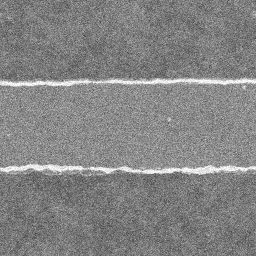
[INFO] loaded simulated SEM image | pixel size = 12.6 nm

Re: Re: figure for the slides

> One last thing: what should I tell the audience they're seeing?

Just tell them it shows one or a few lines or trenches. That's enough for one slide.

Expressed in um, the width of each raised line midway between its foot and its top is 1.11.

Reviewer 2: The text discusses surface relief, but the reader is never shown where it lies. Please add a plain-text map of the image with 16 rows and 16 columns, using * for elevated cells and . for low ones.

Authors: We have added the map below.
................
................
................
................
................
****************
****************
****************
****************
****************
****************
................
................
................
................
................